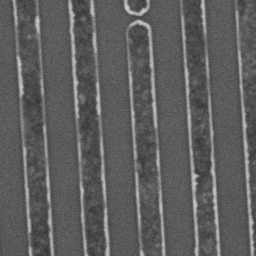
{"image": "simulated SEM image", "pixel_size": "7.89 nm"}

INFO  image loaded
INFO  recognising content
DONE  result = parallel lines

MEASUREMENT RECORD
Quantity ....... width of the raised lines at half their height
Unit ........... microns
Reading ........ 0.19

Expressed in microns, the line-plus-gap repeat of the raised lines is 0.438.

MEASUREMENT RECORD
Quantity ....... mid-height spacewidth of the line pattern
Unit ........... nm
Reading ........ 245